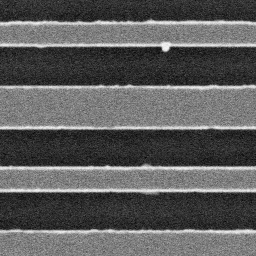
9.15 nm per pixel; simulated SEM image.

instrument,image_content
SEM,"lines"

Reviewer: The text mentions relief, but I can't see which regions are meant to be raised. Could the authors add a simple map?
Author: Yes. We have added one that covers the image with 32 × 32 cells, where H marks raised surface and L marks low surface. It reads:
LLLLLLLLLLLLLLLLLLLLLLLLLLLLLLLL
LLLLLLLLLLLLLLLLLLLLLLLLLLLLLLLL
LLLLLLLLLLLLLLLLLLLLLLLLLLLLLLLL
HHHHHHHHHHHHHHHHHHHHHHHHHHHHHHHH
HHHHHHHHHHHHHHHHHHHHHHHHHHHHHHHH
HHHHHHHHHHHHHHHHHHHHHHHHHHHHHHHH
LLLLLLLLLLLLLLLLLLLLLLLLLLLLLLLL
LLLLLLLLLLLLLLLLLLLLLLLLLLLLLLLL
LLLLLLLLLLLLLLLLLLLLLLLLLLLLLLLL
LLLLLLLLLLLLLLLLLLLLLLLLLLLLLLLL
LLLLLLLLLLLLLLLLLLLLLLLLLLLLLLLL
HHHHHHHHHHHHHHHHHHHHHHHHHHHHHHHH
HHHHHHHHHHHHHHHHHHHHHHHHHHHHHHHH
HHHHHHHHHHHHHHHHHHHHHHHHHHHHHHHH
HHHHHHHHHHHHHHHHHHHHHHHHHHHHHHHH
HHHHHHHHHHHHHHHHHHHHHHHHHHHHHHHH
LLLLLLLLLLLLLLLLLLLLLLLLLLLLLLLL
LLLLLLLLLLLLLLLLLLLLLLLLLLLLLLLL
LLLLLLLLLLLLLLLLLLLLLLLLLLLLLLLL
LLLLLLLLLLLLLLLLLLLLLLLLLLLLLLLL
LLLLLLLLLLLLLLLLLLLLLLLLLLLLLLLL
HHHHHHHHHHHHHHHHHHHHHHHHHHHHHHHH
HHHHHHHHHHHHHHHHHHHHHHHHHHHHHHHH
HHHHHHHHHHHHHHHHHHHHHHHHHHHHHHHH
LLLLLLLLLLLLLLLLLLLLLLLLLLLLLLLL
LLLLLLLLLLLLLLLLLLLLLLLLLLLLLLLL
LLLLLLLLLLLLLLLLLLLLLLLLLLLLLLLL
LLLLLLLLLLLLLLLLLLLLLLLLLLLLLLLL
LLLLLLLLLLLLLLLLLLLLLLLLLLLLLLLL
HHHHHHHHHHHHHHHHHHHHHHHHHHHHHHHH
HHHHHHHHHHHHHHHHHHHHHHHHHHHHHHHH
HHHHHHHHHHHHHHHHHHHHHHHHHHHHHHHH